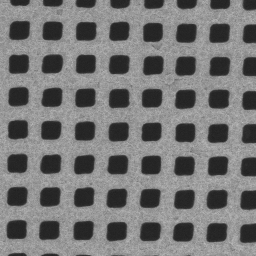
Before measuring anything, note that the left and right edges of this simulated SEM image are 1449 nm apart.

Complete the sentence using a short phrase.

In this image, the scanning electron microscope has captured a regular array of holes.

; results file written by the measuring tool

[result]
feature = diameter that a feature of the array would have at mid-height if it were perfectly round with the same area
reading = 117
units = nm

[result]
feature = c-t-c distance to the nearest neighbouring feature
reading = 186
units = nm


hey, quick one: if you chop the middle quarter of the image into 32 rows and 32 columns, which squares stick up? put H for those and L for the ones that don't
HHHLLLLLHHHLLLLLHHHHLLLLLHHHLLLL
HHHLLLLLHHHLLLLLHHHHLLLLLHHHLLLL
HHHHLHHHHHHHLLHHHHHHLLLLHHHHLLLL
HHHHHHHHHHHHHHHHHHHHHHHHHHHHHHHH
HHHHHHHHHHHHHHHHHHHHHHHHHHHHHHHH
HHHHHHHHHHHHHHHHHHHHHHHHHHHHHHHH
HHHHLLLLHHHHLLLLHHHHHLLLHHHHHLLL
HHHLLLLLHHHLLLLLHHHHLLLLLHHHLLLL
HHHLLLLLHHHLLLLLHHHLLLLLLHHHLLLL
HHHLLLLLHHHLLLLLHHHLLLLLHHHHLLLL
HHHLLLLHHHHLLLLLHHHHLLLLHHHHLLLL
HHHHHHHHHHHHHHHHHHHHHHHHHHHHHHHH
HHHHHHHHHHHHHHHHHHHHHHHHHHHHHHHH
HHHHHHHHHHHHHHHHHHHHHHHHHHHHHHHH
HHHHHLLHHHHHHHHHHHHHHHHHHHHHHHHH
HHHLLLLLHHHHLLLLHHHHLLLLHHHHLLLL
HHHLLLLLHHHLLLLLHHHHLLLLLHHHLLLL
HHHLLLLLHHHLLLLLHHHHLLLLHHHHLLLL
HHHLLLLLHHHLLLLLHHHLLLLLHHHHLLLL
HHHHHHHHHHHHHHHHHHHHHHHHHHHHHLLL
HHHHHHHHHHHHHHHHHHHHHHHHHHHHHHHH
HHHHHHHHHHHHHHHHHHHHHHHHHHHHHHHH
HHHHHHHHHHHHHHHHHHHHHHHHHHHHHHHH
HHHLLLLHHHHLLLLLHHHHLLLLHHHHLLLL
HHHLLLLLHHHLLLLLHHHLLLLLHHHHLLLL
HHLLLLLLHHHLLLLLHHHLLLLLHHHHLLLL
HHLLLLLHHHHLLLLLHHHLLLLLHHHHLLLL
HHHLHHHHHHHHLLLHHHHHHLLHHHHHLLLL
HHHHHHHHHHHHHHHHHHHHHHHHHHHHHHHH
HHHHHHHHHHHHHHHHHHHHHHHHHHHHHHHH
HHHHHHHHHHHHHHHHHHHHHHHHHHHHHHHH
HHHLLLLHHHHHLLLHHHHHLLLLHHHHHHHL